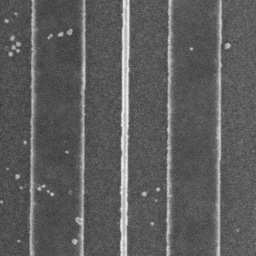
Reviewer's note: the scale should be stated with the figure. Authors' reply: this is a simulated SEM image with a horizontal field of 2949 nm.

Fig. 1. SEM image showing lines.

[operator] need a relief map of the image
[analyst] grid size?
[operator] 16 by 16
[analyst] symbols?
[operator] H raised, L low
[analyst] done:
LLHHHLLLLLLHHHLL
LLHHHLLLLLLHHHLL
LLHHHLLLLLLHHHLL
LLHHHLLLLLLHHHLL
LLHHHLLLLLLHHHLL
LLHHHLLLLLLHHHLL
LLHHHLLLLLLHHHLL
LLHHHLLLLLLHHHLL
LLHHHLLLLLLHHHLL
LLHHHLLLLLHHHHLL
LLHHHLLLLLHHHHLL
LLHHHLLLLLHHHHLL
LLHHHLLLLLHHHHLL
LLHHHLLLLLHHHHLL
LLHHHLLLLLHHHHLL
LLHHHLLLLLHHHHLL